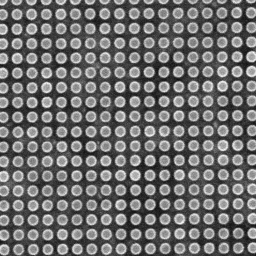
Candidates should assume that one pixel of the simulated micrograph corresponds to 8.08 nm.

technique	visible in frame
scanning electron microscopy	a regular array of raised bodies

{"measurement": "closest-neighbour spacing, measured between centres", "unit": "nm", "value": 117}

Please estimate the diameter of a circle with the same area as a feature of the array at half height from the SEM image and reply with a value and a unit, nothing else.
81.6 nm